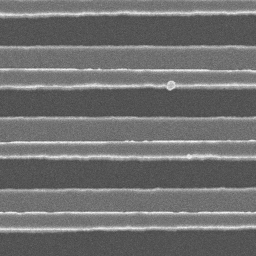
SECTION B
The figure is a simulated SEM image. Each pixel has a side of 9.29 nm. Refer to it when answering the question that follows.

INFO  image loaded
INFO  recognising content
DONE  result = lines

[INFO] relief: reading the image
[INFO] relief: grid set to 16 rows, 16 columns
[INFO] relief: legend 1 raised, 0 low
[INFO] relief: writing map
1111111111111111
0000000000000000
0000000000000000
1111111111111111
1111111111111111
0000000000100000
0000000000000000
1111111111111111
1111111111111111
1111111111111111
0000000000000000
0000000000000000
1111111111111111
1111111111111111
0000000000000000
0000000000000000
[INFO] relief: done